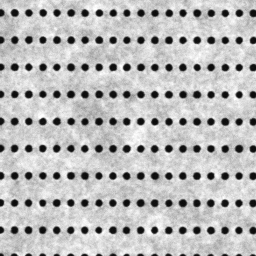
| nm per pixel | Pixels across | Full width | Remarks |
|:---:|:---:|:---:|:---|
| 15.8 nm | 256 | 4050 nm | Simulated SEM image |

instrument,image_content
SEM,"a regular array of holes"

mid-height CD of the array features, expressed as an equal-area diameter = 7.9 pixels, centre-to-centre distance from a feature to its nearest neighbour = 13.8 pixels